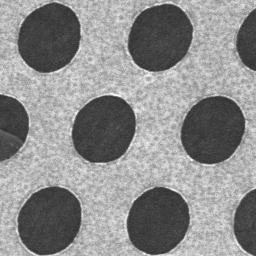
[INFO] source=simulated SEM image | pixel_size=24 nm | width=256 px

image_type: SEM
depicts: holes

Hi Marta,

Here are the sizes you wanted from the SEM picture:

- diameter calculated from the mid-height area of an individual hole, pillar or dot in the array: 1600 nm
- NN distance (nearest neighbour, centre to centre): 2560 nm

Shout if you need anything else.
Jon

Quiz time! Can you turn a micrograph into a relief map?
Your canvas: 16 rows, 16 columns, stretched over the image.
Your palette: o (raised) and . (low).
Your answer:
oo..ooooo..ooooo
o....ooo....ooo.
o....ooo....ooo.
o....ooo....ooo.
oooooooooooooooo
oooooooooooooooo
.oooo...oooo...o
..ooo...ooo....o
..oo....ooo....o
.oooo...oooo...o
oooooooooooooooo
oooooooooooooooo
oo...ooo....ooo.
o....ooo....ooo.
o....ooo....ooo.
oo..ooooo..oooo.